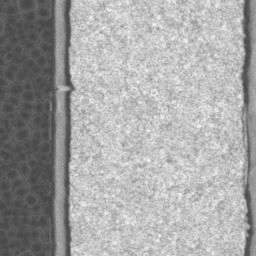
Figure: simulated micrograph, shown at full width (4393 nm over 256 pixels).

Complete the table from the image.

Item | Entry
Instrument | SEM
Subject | one or a few lines or trenches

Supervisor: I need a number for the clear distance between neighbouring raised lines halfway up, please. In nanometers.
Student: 3330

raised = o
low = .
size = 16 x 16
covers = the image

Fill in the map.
oooo............
oooo............
oooo............
oooo............
oooo............
oooo............
oooo............
oooo............
oooo............
oooo............
oooo............
oooo............
oooo............
oooo............
oooo............
oooo............